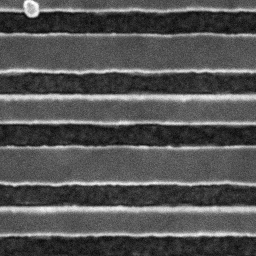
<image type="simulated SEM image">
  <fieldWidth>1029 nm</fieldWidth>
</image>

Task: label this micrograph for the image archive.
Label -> lines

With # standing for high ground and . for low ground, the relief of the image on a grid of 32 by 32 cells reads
################################
..###.......#.....####..........
................................
................................
################################
################################
################################
################################
################################
................................
................................
................................
################################
################################
################################
...#.......######...############
................................
................................
################################
################################
################################
################################
################################
................................
................................
................................
################################
################################
################################
####...######...#########.##.###
................................
................................